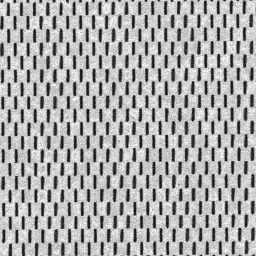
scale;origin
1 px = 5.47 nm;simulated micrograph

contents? a regular array of holes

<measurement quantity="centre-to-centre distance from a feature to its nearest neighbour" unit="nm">71.1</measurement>